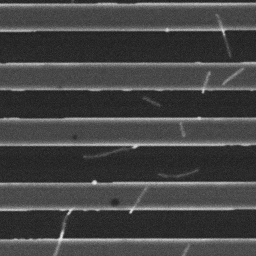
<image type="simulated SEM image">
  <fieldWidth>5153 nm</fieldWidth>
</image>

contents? lines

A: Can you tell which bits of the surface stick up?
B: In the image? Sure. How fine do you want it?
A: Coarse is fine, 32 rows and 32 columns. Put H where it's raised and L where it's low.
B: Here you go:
LLLLLLLLLLLLLLLLLHHHHHLHHHHHHHHH
HHHHHHHHHHHHHHHHHHHHHHHHHHHHHHHH
HHHHHHHHHHHHHHHHHHHHHHHHHHHHHHHH
HHHHHHHHHHHHHHHHHHHHHHHHHHHHHHHH
LLLLLLLLLLLLLLLLLLLLLLLLLLLLLLLL
LLLLLLLLLLLLLLLLLLLLLLLLLLLLLLLL
LLLLLLLLLLLLLLLLLLLLLLLLLLLLLLLL
LLLLLLLLLLLLLLLLLLLLLLLLLLLLLLLL
HHHHHHHHHHHHHHHHHHHHHHHHHHHHHHHH
HHHHHHHHHHHHHHHHHHHHHHHHHHHHHHHH
HHHHHHHHHHHHHHHHHHHHHHHHHHHHHHHH
LLLLLLLLLLLLLLLLLLLLLLLLLLLLLLLL
LLLLLLLLLLLLLLLLLLLLLLLLLLLLLLLL
LLLLLLLLLLLLLLLLLLLLLLLLLLLLLLLL
LLLLLLLLLLLLLLLLLLLLLLLLLLLLLLLL
HHHHHHHHHHHHHHHHHHHHHHHHHHHHHHHH
HHHHHHHHHHHHHHHHHHHHHHHHHHHHHHHH
HHHHHHHHHHHHHHHHHHHHHHHHHHHHHHHH
LLLLLLLLLLLLLLLLLLLLLLLLLLLLLLLL
LLLLLLLLLLLLLLLLLLLLLLLLLLLLLLLL
LLLLLLLLLLLLLLLLLLLLLLLLLLLLLLLL
LLLLLLLLLLLLLLLLLLLLLLLLLLLLLLLL
LLLLLLLLLLLLLLLLLLLLLLLLLLLLLLLL
HHHHHHHHHHHHHHHHHHHHHHHHHHHHHHHH
HHHHHHHHHHHHHHHHHHHHHHHHHHHHHHHH
HHHHHHHHHHHHHHHHHHHHHHHHHHHHHHHH
LLLLLLLLLLLLLLLLLLLLLLLLLLLLLLLL
LLLLLLLLLLLLLLLLLLLLLLLLLLLLLLLL
LLLLLLLLLLLLLLLLLLLLLLLLLLLLLLLL
LLLLLLLLLLLLLLLLLLLLLLLLLLLLLLLL
HHHHHHHHHHHHHHHHHHHHHHHHHHHHHHHH
HHHHHHHHHHHHHHHHHHHHHHHHHHHHHHHH